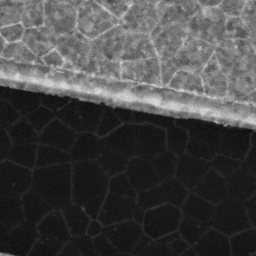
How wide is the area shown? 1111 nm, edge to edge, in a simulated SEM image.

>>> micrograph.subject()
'one or a few lines or trenches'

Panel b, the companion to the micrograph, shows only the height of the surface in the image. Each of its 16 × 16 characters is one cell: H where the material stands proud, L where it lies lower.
HHHHHHHHHHHHHHHH
HHHHHHHHHHHHHHHH
HHHHHHHHHHHHHHHH
HHHHHHHHHHHHHHHH
HHHHHHHHHHHHHHHH
LLLLLHHHHHHHHHHH
LLLLLLLLLLHHHHHH
LLLLLLLLLLLLLLLL
LLLLLLLLLLLLLLLL
LLLLLLLLLLLLLLLL
LLLLLLLLLLLLLLLL
LLLLLLLLLLLLLLLL
LLLLLLLLLLLLLLLL
LLLLLLLLLLLLLLLL
LLLLLLLLLLLLLLLL
LLLLLLLLLLLLLLLL